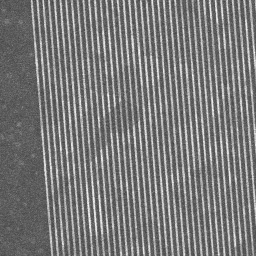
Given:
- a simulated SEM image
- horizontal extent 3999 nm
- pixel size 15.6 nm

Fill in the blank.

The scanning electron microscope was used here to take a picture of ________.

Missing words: parallel lines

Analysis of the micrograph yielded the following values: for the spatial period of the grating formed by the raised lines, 89.5 nm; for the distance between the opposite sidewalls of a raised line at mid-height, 21.4 nm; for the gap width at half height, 66.2 nanometers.